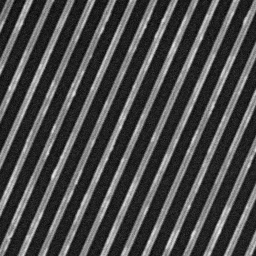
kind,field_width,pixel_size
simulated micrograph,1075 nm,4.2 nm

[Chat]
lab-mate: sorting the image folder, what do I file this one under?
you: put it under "parallel lines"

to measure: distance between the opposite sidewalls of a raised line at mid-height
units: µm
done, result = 0.0221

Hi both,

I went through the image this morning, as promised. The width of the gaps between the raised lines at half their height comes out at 57.7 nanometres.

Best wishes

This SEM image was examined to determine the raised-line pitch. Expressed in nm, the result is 79.4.